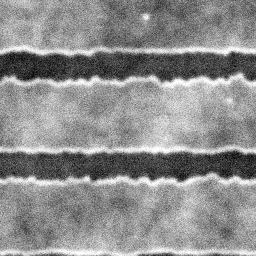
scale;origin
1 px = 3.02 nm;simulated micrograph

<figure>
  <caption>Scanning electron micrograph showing lines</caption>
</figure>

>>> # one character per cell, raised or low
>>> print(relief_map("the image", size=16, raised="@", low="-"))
@@@@@@@@@@@@@@@@
@@@@@@@@@@@@@@@@
@@@@@@@@@@@@@@@@
----------------
----------------
@@@@@@@@@@@@@@@@
@@@@@@@@@@@@@@@@
@@@@@@@@@@@@@@@@
@@@@@@@@@@@@@@@@
------------@---
----------------
@@@@@@@@@@@@@@@@
@@@@@@@@@@@@@@@@
@@@@@@@@@@@@@@@@
@@@@@@@@@@@@@@@@
@@@@@@@@@@@@@@@@